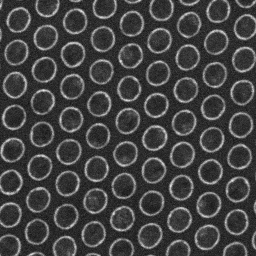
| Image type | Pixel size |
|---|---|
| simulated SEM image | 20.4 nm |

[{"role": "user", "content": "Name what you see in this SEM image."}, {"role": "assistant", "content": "a regular array of raised bodies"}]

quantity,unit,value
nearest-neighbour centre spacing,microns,0.657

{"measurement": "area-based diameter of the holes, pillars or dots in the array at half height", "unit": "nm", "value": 483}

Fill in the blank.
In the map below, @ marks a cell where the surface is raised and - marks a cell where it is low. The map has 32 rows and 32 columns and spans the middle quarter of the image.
-@@----@@@@@---@@@---@@@@@---@@@
-------@@@@@---------@@@@@------
-------@@@@@---------@@@@@------
@@@@---@@@@@---@@@---@@@@@------
@@@@@---@@@---@@@@@--@@@@---@@@@
@@@@@---------@@@@@---------@@@@
@@@@@---------@@@@@---------@@@@
@@@@----@@----@@@@@----@----@@@@
-@@----@@@@---@@@@---@@@@---@@@@
------@@@@@---------@@@@@@----@-
------@@@@@---------@@@@@@------
@@@@--@@@@@----@@---@@@@@@------
@@@@---@@@----@@@@---@@@@---@@@@
@@@@@--------@@@@@@---------@@@@
@@@@---------@@@@@@--------@@@@@
@@@@---@@@---@@@@@---------@@@@@
@@@---@@@@@---@@@@---@@@@---@@@@
------@@@@@---------@@@@@----@@-
------@@@@@---------@@@@@-------
@@@---@@@@@---------@@@@@-------
@@@@---@@@---@@@@@--@@@@@---@@@@
@@@@---------@@@@@---------@@@@@
@@@@--------@@@@@@---------@@@@@
@@@@---@@----@@@@@---------@@@@@
@@----@@@@@--@@@@---@@@@---@@@@@
-----@@@@@@---------@@@@@---@@--
-----@@@@@@---------@@@@@-------
@@@---@@@@@----@----@@@@@-------
@@@@--@@@@---@@@@---@@@@----@@@-
@@@@--------@@@@@@---@@----@@@@@
@@@@--------@@@@@@---------@@@@@
@@@----@@---@@@@@@---------@@@@@